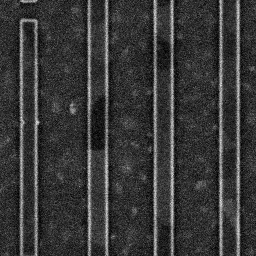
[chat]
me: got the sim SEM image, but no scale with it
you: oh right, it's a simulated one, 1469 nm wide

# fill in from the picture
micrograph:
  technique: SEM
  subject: one or a few lines or trenches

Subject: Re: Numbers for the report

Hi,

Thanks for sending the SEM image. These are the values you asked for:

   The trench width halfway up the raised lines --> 277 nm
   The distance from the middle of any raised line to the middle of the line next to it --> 384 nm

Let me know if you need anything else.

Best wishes